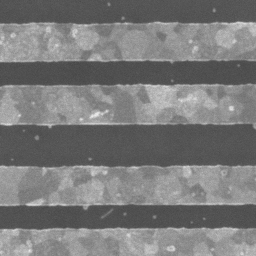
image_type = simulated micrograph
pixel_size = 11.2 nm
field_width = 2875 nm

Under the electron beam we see lines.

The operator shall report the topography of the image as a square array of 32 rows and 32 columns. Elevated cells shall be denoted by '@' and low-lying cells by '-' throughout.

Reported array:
--------------------------------
--------------------------------
--------------------------------
@@@@@@@@@@@@@@@@@@@@@@@@@@@@@@@@
@@@@@@@@@@@@@@@@@@@@@@@@@@@@@@@@
@@@@@@@@@@@@@@@@@@@@@@@@@@@@@@@@
@@@@@@@@@@@@@@@@@@@@@@@@@@@@@@@@
@@@@@@@@@@@@@@@@@@@@@@@@@@-@@--@
--------------------------------
--------------------------------
--------------------------------
@@@@@@@@@@@@@@@@@@@@@@@@@@@@@@@@
@@@@@@@@@@@@@@@@@@@@@@@@@@@@@@@@
@@@@@@@@@@@@@@@@@@@@@@@@@@@@@@@@
@@@@@@@@@@@@@@@@@@@@@@@@@@@@@@@@
@@--@@@-------------------------
--------------------------------
--------------------------------
--------------------------------
--------------------------------
--------------------------------
@@@@@@@@@@@@@@@@@@@@@@@@@@@@@@@@
@@@@@@@@@@@@@@@@@@@@@@@@@@@@@@@@
@@@@@@@@@@@@@@@@@@@@@@@@@@@@@@@@
@@@@@@@@@@@@@@@@@@@@@@@@@@@@@@@@
@@@@@@@@@@@@@@@@@@@@@@@@@@@-@@@-
--------------------------------
--------------------------------
--------------------------------
@@@@@@@@@@@@@@@@@@@@@@@@@@@@@@@@
@@@@@@@@@@@@@@@@@@@@@@@@@@@@@@@@
@@@@@@@@@@@@@@@@@@@@@@@@@@@@@@@@